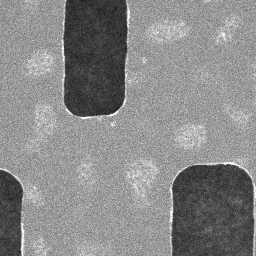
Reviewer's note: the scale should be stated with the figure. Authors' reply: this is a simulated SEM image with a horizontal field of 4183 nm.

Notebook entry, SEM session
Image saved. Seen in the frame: holes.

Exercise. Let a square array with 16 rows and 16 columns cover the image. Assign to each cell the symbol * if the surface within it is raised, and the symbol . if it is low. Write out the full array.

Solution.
****....********
****....********
****....********
****....********
****....********
****....********
****....********
****************
****************
****************
************...*
.**********.....
.**********.....
.**********.....
.**********.....
.**********.....